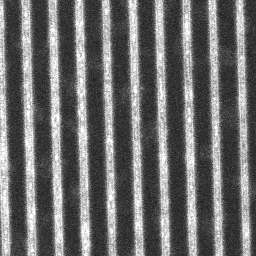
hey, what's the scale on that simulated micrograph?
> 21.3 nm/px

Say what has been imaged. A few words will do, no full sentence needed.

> parallel lines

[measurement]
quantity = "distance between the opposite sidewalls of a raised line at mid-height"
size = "447 nm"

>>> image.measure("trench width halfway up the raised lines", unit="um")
0.114